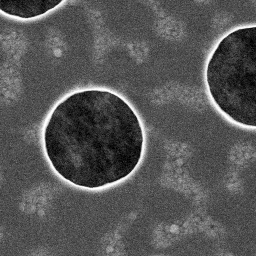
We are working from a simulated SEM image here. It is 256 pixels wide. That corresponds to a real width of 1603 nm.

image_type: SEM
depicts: holes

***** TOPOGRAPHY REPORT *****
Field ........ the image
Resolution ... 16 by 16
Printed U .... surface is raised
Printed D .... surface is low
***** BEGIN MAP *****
DDDUUUUUUUUUUUUU
UUUUUUUUUUUUUUUU
UUUUUUUUUUUUUUDD
UUUUUUUUUUUUUDDD
UUUUUUUUUUUUUDDD
UUUUUUUUUUUUUDDD
UUUUDDDDUUUUUUDD
UUUDDDDDDUUUUUUD
UUUDDDDDDUUUUUUU
UUUDDDDDDUUUUUUU
UUUDDDDDUUUUUUUU
UUUUUDDUUUUUUUUU
UUUUUUUUUUUUUUUU
UUUUUUUUUUUUUUUU
UUUUUUUUUUUUUUUU
UUUUUUUUUUUUUUUU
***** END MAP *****